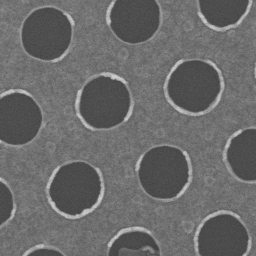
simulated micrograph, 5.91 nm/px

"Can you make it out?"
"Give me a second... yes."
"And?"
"holes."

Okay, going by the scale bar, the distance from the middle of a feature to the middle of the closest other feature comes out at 532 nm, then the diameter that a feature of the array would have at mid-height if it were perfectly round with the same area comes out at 310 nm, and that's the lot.